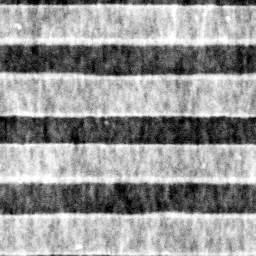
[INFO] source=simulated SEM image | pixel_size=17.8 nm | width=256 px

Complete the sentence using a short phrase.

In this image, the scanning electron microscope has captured lines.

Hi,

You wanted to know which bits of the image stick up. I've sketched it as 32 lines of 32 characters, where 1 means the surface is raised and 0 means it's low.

00000000000000000000000000000000
11111111111111111111111111111111
11111111111111111111111111111111
11111111111111111111111111111111
11111111111111111111111111111111
00000000000000000000000000000000
00000000000000000000000000000000
00000000000000000000000000000000
00000000000000000000000000000000
00000000000000000000000000000000
11111111111111111111111111111111
11111111111111111111111111111111
11111111111111111111111111111111
11111111111111111111111111111111
00000000000000000000000000000010
00000000000000000000000000000000
00000000000000000000000000000000
00000000000000000000000000000000
11111111111111111111111111111111
11111111111111111111111111111111
11111111111111111111111111111111
11111111111111111111111111111111
00000000000000000000000000000000
00000000000000000000000000000000
00000000000000000000000000000000
00000000000000000000000000000000
00000000000000000000000000000000
11111111111111111111111111111111
11111111111111111111111111111111
11111111111111111111111111111111
11111111111111111111111111111111
11111111111111111111111111111111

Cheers